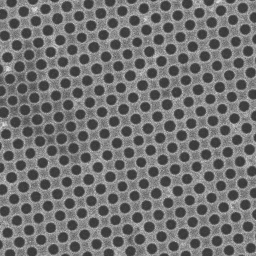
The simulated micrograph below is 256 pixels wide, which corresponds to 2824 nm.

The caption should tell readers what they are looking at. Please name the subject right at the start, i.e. a regular array of holes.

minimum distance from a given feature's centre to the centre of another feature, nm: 168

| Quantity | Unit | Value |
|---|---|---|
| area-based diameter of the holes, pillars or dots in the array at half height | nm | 114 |